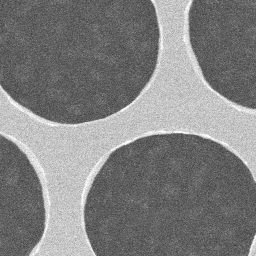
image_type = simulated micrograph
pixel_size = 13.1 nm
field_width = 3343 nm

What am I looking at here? holes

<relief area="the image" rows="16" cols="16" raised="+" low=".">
..........++....
..........++....
..........++....
..........++....
..........++....
.........++++...
+.......+++++++.
+++...++++++++++
+++++++++....+++
..+++++........+
..++++.........+
...+++..........
...++...........
...++...........
...++...........
..++++..........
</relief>